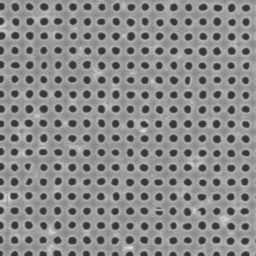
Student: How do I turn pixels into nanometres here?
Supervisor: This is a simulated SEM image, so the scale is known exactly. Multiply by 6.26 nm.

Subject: a regular array of holes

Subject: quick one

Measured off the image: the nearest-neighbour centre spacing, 0.0877 µm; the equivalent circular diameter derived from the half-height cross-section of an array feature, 48.9 nm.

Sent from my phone